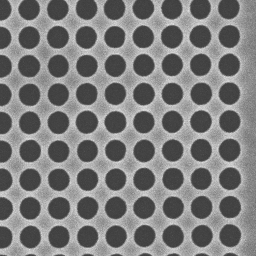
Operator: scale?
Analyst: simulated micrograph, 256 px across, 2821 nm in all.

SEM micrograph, a regular array of holes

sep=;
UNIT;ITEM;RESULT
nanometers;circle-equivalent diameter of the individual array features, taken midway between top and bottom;248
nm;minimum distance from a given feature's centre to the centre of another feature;311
